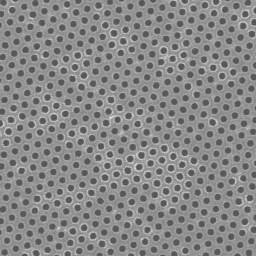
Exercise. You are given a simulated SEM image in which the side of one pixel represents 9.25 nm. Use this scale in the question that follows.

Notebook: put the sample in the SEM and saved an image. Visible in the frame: a regular array of holes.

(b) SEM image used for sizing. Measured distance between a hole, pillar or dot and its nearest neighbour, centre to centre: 107 nm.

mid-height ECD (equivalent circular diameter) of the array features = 62.6 nanometres